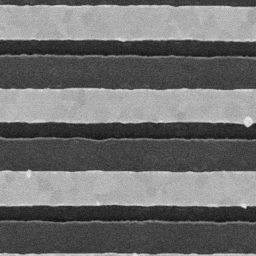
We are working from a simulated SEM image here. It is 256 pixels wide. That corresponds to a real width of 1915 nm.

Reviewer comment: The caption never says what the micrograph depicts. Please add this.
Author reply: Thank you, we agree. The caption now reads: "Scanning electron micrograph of lines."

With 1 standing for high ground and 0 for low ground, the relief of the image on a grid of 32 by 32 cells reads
00000000000000000000000000000000
11111111111111111111111111111111
11111111111111111111111111111111
11111111111111111111111111111111
11111111111111111111111111111111
00000000000000000000000000000000
00000000000000000000000000000000
00000000000000000000000000000000
00000000000000000000000000000000
00000000000000000000000000000000
00000000000000000000000000000000
11111111111111111111111111111111
11111111111111111111111111111111
11111111111111111111111111111111
11111111111111111111111111111111
00000000000000000000000000000011
00000000000000000000000000000000
00000000000000000000000000000000
00000000000000000000000000000000
00000000000000000000000000000000
00000000000000000000000000000000
11111111111111111111110111111111
11111111111111111111111111111111
11111111111111111111111111111111
11111111111111111111111111111111
11111111111111111111111111111111
00000000000000000000000000000000
00000000000000000000000000000000
00000000000000000000000000000000
00000000000000000000000000000000
00000000000000000000000000000000
00000000000000000000000000000000